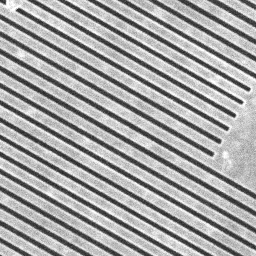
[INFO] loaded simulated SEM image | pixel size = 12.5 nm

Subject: parallel lines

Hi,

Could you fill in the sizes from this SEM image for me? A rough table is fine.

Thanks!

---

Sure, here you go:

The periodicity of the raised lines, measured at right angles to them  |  187 nanometers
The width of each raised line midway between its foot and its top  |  124 nm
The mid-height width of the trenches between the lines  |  4.99 pixels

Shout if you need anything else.